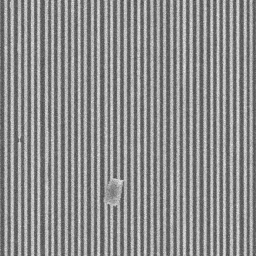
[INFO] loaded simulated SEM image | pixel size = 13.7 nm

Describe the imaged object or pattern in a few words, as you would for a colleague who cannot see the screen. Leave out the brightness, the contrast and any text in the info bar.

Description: parallel lines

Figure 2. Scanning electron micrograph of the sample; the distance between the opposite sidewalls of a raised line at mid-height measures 0.0378 um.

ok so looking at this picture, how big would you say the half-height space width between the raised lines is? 0.0498 microns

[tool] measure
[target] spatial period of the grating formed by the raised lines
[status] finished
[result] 91 nm